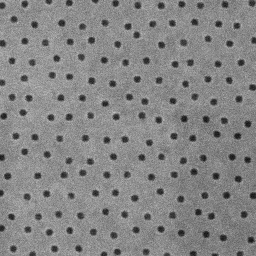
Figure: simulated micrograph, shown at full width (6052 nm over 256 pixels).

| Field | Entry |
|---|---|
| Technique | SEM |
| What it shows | a regular array of holes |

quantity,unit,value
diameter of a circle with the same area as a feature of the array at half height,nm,196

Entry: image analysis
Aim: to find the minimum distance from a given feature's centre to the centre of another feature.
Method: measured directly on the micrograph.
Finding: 432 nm